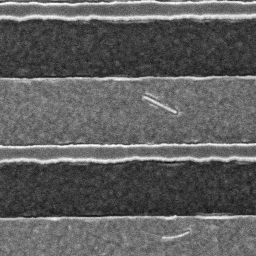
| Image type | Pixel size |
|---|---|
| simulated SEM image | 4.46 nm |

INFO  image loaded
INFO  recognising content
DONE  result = lines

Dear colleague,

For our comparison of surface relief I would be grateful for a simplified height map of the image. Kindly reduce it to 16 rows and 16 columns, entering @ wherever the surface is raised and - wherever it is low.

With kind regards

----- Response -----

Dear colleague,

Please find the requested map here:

@@@@@@@@@@@@@@@@
----------------
----------------
----------------
----------------
@@@@@@@@@@@@@@@@
@@@@@@@@@@@@@@@@
@@@@@@@@@@@@@@@@
@@@@@@@@@@@@@@@@
@@@@@@@@@@@@@@@@
----------------
----------------
----------------
--------------@@
@@@@@@@@@@@@@@@@
@@@@@@@@@@@@@@@@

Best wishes